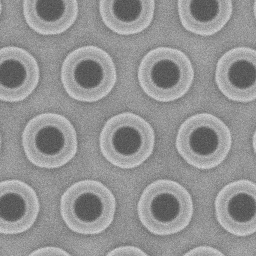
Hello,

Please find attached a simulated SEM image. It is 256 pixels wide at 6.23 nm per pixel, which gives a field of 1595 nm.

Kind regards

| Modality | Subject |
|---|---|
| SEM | an array of small figures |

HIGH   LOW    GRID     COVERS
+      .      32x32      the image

...+++++++..+++++++...+++++++...
...+++++++...++++++...+++++++...
...++++++....++++++....+++++....
....++++......++++.....+++++....
................................
................................
+++......++++......++++......+++
++++....++++++....++++++...+++++
+++++...++++++...+++++++...+++++
+++++...++++++...+++++++...+++++
+++++...++++++....++++++...+++++
++++....++++++....+++++.....++++
+++.......++........+........++.
................................
.....+++.......++.......+++.....
...++++++....++++++....+++++....
...++++++....++++++...+++++++...
...+++++++...++++++...+++++++...
...+++++++...++++++...+++++++...
...++++++....++++++....+++++....
....++++......+++.......+++.....
................................
................................
++++.....++++.....+++++.....++++
+++++...++++++....++++++...+++++
+++++...++++++...+++++++...+++++
+++++...++++++...+++++++...+++++
++++....++++++....++++++...+++++
++++.....++++.....+++++.....++++
................................
................................
....++++......++++......+++.....